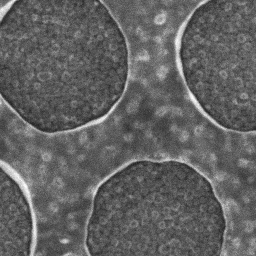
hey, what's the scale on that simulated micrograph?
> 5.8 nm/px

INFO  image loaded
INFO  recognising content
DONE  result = holes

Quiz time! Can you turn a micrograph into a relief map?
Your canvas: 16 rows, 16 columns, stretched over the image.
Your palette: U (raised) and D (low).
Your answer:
UDDDDDDUUUUUDDDD
DDDDDDDUUUUUDDDD
DDDDDDDDUUUDDDDD
DDDDDDDDUUUDDDDD
DDDDDDDDUUUDDDDD
DDDDDDDDUUUUDDDD
UDDDDDDUUUUUDDDD
UUDDDDUUUUUUUDDD
UUUUUUUUUUUUUUUU
UUUUUUUUUUUUUUUU
UUUUUUUUDDDDUUUU
DUUUUUDDDDDDDUUU
DDUUUUDDDDDDDDUU
DDUUUUDDDDDDDDUU
DDUUUDDDDDDDDDUU
DDUUUDDDDDDDDDUU